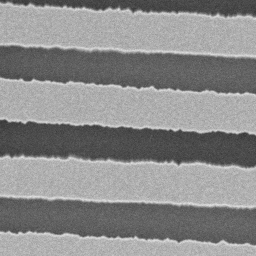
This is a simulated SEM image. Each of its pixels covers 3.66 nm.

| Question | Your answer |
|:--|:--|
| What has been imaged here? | lines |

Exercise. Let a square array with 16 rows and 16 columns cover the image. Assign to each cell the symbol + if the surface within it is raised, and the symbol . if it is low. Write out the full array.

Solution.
+++++...........
++++++++++++++++
++++++++++++++++
..............++
................
+++++++++.......
++++++++++++++++
++++++++++++++++
................
................
+++++++++++++++.
++++++++++++++++
.....+++++++++++
................
................
++++++++++++++++